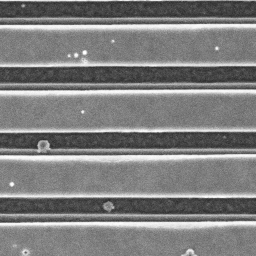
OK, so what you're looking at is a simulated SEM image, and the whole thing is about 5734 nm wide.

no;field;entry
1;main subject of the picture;lines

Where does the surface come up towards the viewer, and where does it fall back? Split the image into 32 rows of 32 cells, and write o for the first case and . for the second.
................................
................................
................................
oooooooooooooooooooooooooooooooo
oooooooooooooooooooooooooooooooo
oooooooooooooooooooooooooooooooo
oooooooooooooooooooooooooooooooo
oooooooooooooooooooooooooooooooo
................................
................................
................................
oooooooooooooooooooooooooooooooo
oooooooooooooooooooooooooooooooo
oooooooooooooooooooooooooooooooo
oooooooooooooooooooooooooooooooo
oooooooooooooooooooooooooooooooo
................................
................................
................................
ooo..ooooooooooooooooooooooooooo
oooooooooooooooooooooooooooooooo
oooooooooooooooooooooooooooooooo
oooooooooooooooooooooooooooooooo
oooooooooooooooooooooooooooooooo
oooooooooooooooooooooooooooooooo
................................
................................
................................
oooooooooooooooooooooooooooooooo
oooooooooooooooooooooooooooooooo
oooooooooooooooooooooooooooooooo
oooooooooooooooooooooooooooooooo